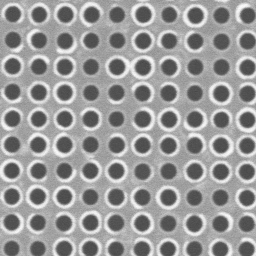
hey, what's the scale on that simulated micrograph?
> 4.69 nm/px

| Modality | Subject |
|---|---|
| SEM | a regular array of holes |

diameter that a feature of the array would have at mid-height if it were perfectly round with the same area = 77.1 nm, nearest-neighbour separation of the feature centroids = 0.121 micrometres